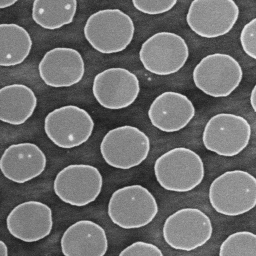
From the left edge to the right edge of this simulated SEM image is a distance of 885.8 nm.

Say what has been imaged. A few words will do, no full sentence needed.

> a regular array of raised bodies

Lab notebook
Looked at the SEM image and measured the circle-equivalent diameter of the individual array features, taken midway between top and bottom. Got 0.154 microns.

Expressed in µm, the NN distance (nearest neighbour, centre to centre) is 0.202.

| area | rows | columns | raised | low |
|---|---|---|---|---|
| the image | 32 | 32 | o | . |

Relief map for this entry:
oo..ooooo........ooooo..ooooo...
....ooooo...ooo...oo....oooooo..
....ooooo..ooooo.......oooooo...
ooo...o....oooooo.......ooooo..o
oooo.......oooooo..ooo....o...oo
oooo.......ooooo..ooooo.......oo
oooo..oooo...o....ooooo........o
ooo..ooooo........ooooo..oooo...
.....ooooo........oooo...ooooo..
.....ooooo..ooooo.......oooooo..
......ooo...ooooo.......oooooo..
oooo........ooooo.........ooo...
oooo........ooooo..ooooo.......o
oooo....oo....o....ooooo........
oooo..ooooo........ooooo...oo...
......oooooo.......oooo...ooooo.
......ooooo...oooo........ooooo.
.......oooo..ooooo.......oooooo.
.oooo........oooooo.......oooo..
oooooo.......ooooo..ooooo.......
oooooo........ooo..oooooo.......
ooooo...oooo.......oooooo....oo.
.ooo...oooooo.......ooooo..ooooo
.......oooooo..ooo...ooo..oooooo
.......ooooo..ooooo.......oooooo
...oo....oo...oooooo......oooooo
.ooooo........oooooo..ooo..oooo.
.ooooo........ooooo..ooooo......
.ooooo...oooo........ooooo......
..oooo..ooooo........ooooo...ooo
........ooooo....oo..oooo...oooo
o.......ooooo..ooooo........oooo